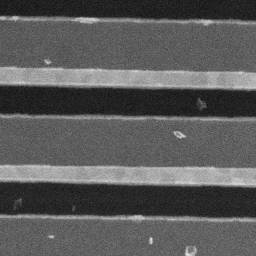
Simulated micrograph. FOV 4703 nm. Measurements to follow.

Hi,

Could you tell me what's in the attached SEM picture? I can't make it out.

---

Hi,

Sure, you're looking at lines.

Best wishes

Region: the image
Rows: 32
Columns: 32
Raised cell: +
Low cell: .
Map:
................................
................................
++++++.+.+++....................
++++++++++++++++++++++++++++++++
++++++++++++++++++++++++++++++++
++++++++++++++++++++++++++++++++
++++++++++++++++++++++++++++++++
++++++++++++++++++++++++++++++++
++++++++++++++++++++++++++++++++
++++++++++++++++++++++++++++++++
....++++++++++++++++++++++++++++
................................
................................
................................
................................
++++++++++++++++++++++++++++++++
++++++++++++++++++++++++++++++++
++++++++++++++++++++++++++++++++
++++++++++++++++++++++++++++++++
++++++++++++++++++++++++++++++++
++++++++++++++++++++++++++++++++
++++++++++++++++++++++++++++++++
......++++++++++++++++++++++++++
................................
................................
................................
................................
+++++++++++++++++++++++++.......
++++++++++++++++++++++++++++++++
++++++++++++++++++++++++++++++++
++++++++++++++++++++++++++++++++
++++++++++++++++++++++++++++++++